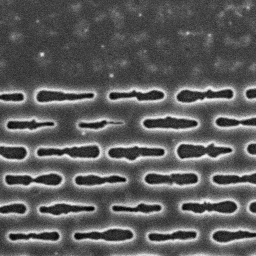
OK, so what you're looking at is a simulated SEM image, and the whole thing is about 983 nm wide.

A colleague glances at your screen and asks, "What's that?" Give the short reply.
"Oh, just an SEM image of a regular array of holes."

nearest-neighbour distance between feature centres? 160 nanometres